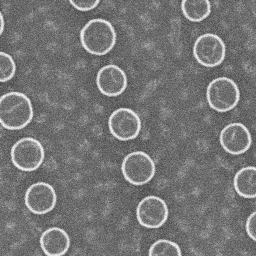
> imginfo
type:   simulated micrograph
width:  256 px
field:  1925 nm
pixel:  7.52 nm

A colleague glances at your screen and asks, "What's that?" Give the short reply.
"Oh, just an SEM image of a regular array of raised bodies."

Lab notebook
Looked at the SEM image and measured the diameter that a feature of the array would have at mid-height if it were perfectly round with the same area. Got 227 nm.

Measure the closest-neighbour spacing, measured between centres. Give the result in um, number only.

0.346